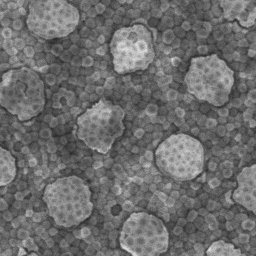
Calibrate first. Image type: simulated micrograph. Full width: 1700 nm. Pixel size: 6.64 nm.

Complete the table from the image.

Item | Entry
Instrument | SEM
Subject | raised bodies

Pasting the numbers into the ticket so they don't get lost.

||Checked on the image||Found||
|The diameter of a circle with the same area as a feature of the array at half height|302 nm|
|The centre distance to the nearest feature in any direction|0.551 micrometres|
